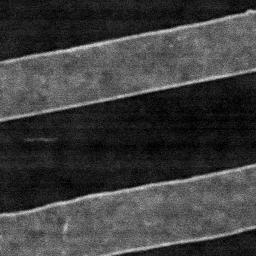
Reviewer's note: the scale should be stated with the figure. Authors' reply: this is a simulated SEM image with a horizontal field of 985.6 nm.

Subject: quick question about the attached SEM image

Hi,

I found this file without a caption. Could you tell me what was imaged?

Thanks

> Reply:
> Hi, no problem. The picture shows one or a few lines or trenches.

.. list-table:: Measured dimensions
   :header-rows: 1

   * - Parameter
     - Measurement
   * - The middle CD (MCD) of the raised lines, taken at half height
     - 219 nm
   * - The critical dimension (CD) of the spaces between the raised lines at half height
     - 359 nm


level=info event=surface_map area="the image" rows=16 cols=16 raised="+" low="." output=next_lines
................
............++++
.......+++++++++
..++++++++++++++
+++++++++++++++.
++++++++++......
+++++...........
................
................
................
...............+
..........++++++
.....+++++++++++
++++++++++++++++
+++++++++++++++.
+++++++++.......